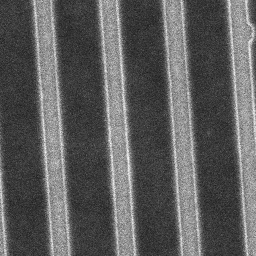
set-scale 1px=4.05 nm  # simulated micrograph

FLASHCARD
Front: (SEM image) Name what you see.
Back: one or a few lines or trenches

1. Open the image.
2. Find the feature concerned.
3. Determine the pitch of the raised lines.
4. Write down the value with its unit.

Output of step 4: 262 nanometers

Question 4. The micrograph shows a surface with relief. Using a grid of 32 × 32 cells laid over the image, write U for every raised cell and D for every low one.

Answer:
UUUUDDUUUUUUUDDUUUUUUDDUUUUUUDDU
UUUUDDUUUUUUUDDUUUUUUDDUUUUUUDDU
UUUUUDDUUUUUUDDUUUUUUDDUUUUUUDDU
UUUUUDDUUUUUUDDUUUUUUDDUUUUUUDDU
UUUUUDDUUUUUUDDUUUUUUDDUUUUUUDDD
UUUUUDDUUUUUUDDUUUUUUDDUUUUUUDDU
UUUUUDDUUUUUUDDUUUUUUDDUUUUUUDDU
UUUUUDDUUUUUUDDUUUUUUDDUUUUUUDDU
UUUUUDDUUUUUUDDUUUUUUDDUUUUUUDDU
UUUUUDDUUUUUUDDUUUUUUDDUUUUUUDDU
UUUUUDDUUUUUUDDUUUUUUDDUUUUUUDDU
UUUUUDDUUUUUUDDUUUUUUDDUUUUUUDDD
UUUUUDDUUUUUUUDUUUUUUDDDUUUUUUDD
UUUUUDDUUUUUUUDUUUUUUDDDUUUUUUDD
UUUUUDDUUUUUUUDDUUUUUUDDUUUUUUDD
UUUUUDDUUUUUUUDDUUUUUUDDUUUUUUDD
UUUUUUDDUUUUUUDDUUUUUUDDUUUUUUDD
UUUUUUDDUUUUUUDDUUUUUUDDUUUUUUDD
UUUUUUDDUUUUUUDDUUUUUUDDUUUUUUDD
UUUUUUDDUUUUUUDDUUUUUUDDUUUUUUDD
UUUUUUDDUUUUUUDDUUUUUUDDUUUUUUDD
UUUUUUDDUUUUUUDDUUUUUUDDUUUUUUDD
UUUUUUDDUUUUUUDDUUUUUUDDUUUUUUDD
UUUUUUDDUUUUUUDDUUUUUUDDUUUUUUDD
UUUUUUDDUUUUUUDDUUUUUUDDUUUUUUDD
UUUUUUDDUUUUUUDDUUUUUUDDUUUUUUUD
UUUUUUDDUUUUUUUDUUUUUUDDDUUUUUUD
UUUUUUDDUUUUUUUDUUUUUUUDDUUUUUUD
UUUUUUDDUUUUUUUDDUUUUUUDDUUUUUUD
UUUUUUDDUUUUUUUDDUUUUUUDDUUUUUUD
DUUUUUUDDUUUUUUDDUUUUUUDDUUUUUUD
DUUUUUUDDUUUUUUDDUUUUUUDDUUUUUUD